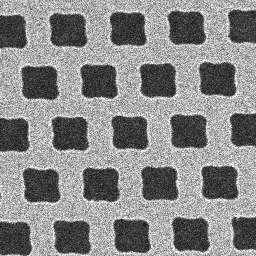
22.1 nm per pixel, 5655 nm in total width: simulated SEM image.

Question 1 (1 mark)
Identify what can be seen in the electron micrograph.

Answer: a regular array of holes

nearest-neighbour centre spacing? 1300 nm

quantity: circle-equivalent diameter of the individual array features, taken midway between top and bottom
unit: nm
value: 853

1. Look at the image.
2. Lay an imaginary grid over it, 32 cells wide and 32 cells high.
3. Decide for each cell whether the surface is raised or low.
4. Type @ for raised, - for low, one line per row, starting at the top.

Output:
@@@@@@@@@@@@@@@@@@@@@@@@@@@@@@@@
@@@@@@@@@@@@@@@@@@@@@----@@@@---
---@@@-----@@@----@@@----@@@@---
---@@@-----@@@----@@@-----@@@---
---@@@-----@@@----@@@-----@@@---
---@@@@----@@@----@@@@---@@@@@@@
@@@@@@@@@@@@@@@@@@@@@@@@@@@@@@@@
@@@@@@@@@@@@@@@@@@@@@@@@@@@@@@@@
@@@----@@@----@@@-----@@@----@@@
@@@----@@@-----@@@----@@@----@@@
@@@----@@@-----@@@----@@@----@@@
@@@----@@@-----@@@----@@@----@@@
@@@@@@@@@@@@@@@@@@@@@@@@@@@@@@@@
@@@@@@@@@@@@@@@@@@@@@@@@@@@@@@@@
@@@@@@@@@@@@@@@-@@@@@@---@@@@---
----@@-----@@@----@@@-----@@@---
----@@@----@@@----@@@-----@@@---
----@@@----@@@-----@@-----@@@---
----@@@----@@@----@@@@-@-@@@@@@@
@@@@@@@@@@@@@@@@@@@@@@@@@@@@@@@@
@@@@@@@@@@@@@@@@@@@@@@@@@@@@@@@@
@@@----@@@-----@@@----@@@-----@@
@@@----@@@-----@@@----@@@-----@@
@@@----@@@-----@@@----@@@-----@@
@@@-----@@-----@@@----@@@-----@@
@@@@@@@@@@@@@@@@@@@@@@@@@@@@@@@@
@@@@@@@@@@@@@@@@@@@@@@@@@@@@@@@@
@@@@@@@@@@@@@@@---@@@@----@@@---
----@@@----@@@-----@@@----@@@---
----@@@----@@@-----@@@----@@@---
----@@@----@@@-----@@@----@@@---
----@@@----@@@@---@@@@@@@@@@@@@@